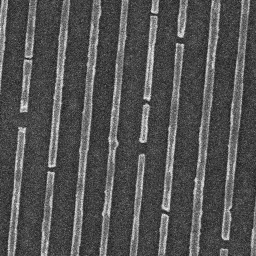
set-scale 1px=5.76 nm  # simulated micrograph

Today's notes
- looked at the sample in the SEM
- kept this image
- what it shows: parallel lines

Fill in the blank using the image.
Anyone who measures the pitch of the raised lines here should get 174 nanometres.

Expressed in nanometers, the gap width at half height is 134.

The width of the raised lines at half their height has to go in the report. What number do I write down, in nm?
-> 40.9